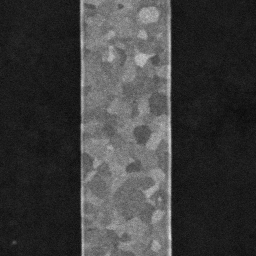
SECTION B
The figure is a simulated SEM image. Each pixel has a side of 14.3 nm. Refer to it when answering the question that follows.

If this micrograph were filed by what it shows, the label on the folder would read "wiring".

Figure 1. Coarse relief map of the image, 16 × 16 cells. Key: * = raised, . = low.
.....******.....
.....******.....
.....******.....
.....******.....
.....******.....
.....******.....
.....******.....
.....******.....
.....******.....
.....******.....
.....******.....
.....******.....
.....******.....
.....******.....
.....******.....
.....******.....